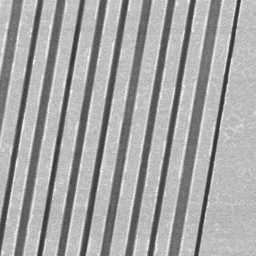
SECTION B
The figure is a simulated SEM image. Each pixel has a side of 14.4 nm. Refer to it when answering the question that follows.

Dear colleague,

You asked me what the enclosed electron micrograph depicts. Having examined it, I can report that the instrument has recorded parallel lines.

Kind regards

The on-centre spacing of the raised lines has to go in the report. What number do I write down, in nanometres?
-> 316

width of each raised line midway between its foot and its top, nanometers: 200